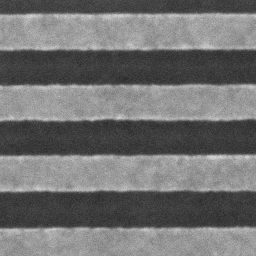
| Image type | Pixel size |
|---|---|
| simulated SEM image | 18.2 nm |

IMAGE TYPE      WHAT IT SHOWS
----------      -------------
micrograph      lines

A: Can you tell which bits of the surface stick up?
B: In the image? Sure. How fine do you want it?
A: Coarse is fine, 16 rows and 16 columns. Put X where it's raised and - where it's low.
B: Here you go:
----------------
XXXXXXXXXXXXXXXX
XXXXXXXXXXXXXXXX
----------------
----------------
XXXXXXXXXXXXXXXX
XXXXXXXXXXXXXXXX
XXXXXX----XX-XX-
----------------
----------------
XXXXXXXXXXXXXXXX
XXXXXXXXXXXXXXXX
----------------
----------------
XXXXXXXXXXXXXXXX
XXXXXXXXXXXXXXXX